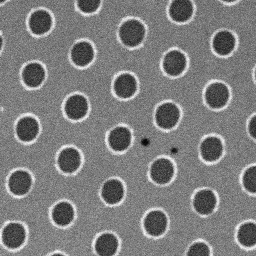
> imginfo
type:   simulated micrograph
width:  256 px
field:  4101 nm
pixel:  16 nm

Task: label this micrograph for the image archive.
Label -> a regular array of holes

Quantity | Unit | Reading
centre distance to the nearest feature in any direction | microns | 0.845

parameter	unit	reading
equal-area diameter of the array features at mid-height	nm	411